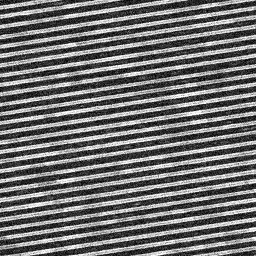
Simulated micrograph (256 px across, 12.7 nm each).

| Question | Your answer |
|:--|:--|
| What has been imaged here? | parallel lines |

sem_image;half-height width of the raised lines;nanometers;33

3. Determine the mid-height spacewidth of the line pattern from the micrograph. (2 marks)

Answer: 84.8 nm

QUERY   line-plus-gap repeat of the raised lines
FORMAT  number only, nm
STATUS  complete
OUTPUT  121